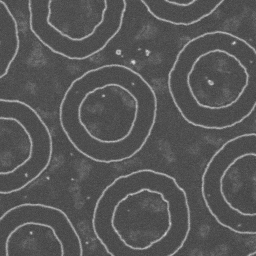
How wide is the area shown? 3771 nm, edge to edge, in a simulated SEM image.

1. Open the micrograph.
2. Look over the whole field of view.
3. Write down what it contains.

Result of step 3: ring-shaped raised bodies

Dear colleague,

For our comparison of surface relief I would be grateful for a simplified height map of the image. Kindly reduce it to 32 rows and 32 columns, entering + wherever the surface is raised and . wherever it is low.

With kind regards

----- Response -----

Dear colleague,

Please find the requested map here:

+...++.......+++..++++.++++.....
+...++.......++....+++++++......
++..++.......++.....+++++.......
++..+++.....+++.................
++...+++...+++...........++++...
++....+++++++..........++++++++.
++.....+++++...........+++..++++
++....................+++.....++
+...........++++......++......++
..........++++++++...+++.......+
.........+++++++++...+++.......+
........+++.....+++..+++......++
........+++......++...+++....+++
++++....++.......++...++++++++++
+++++...++.......++....++++++++.
..++++..++.......++.....+++++...
...+++..+++.....+++.............
....++...++++..+++...........+++
....++....++++++++..........++++
....++.....+++++...........++++.
...+++....................+++...
.++++............++.......++....
++++..........++++++++...+++....
+++..........++++++++++..+++....
.............+++....+++..+++....
............+++......++...+++...
.+++++++....++.......+++..++++..
+++++++++...++.......+++...+++++
++....+++...++.......+++.....+++
+......+++..+++.....+++.........
+.......++...+++...++++.........
+.......++....++++++++..........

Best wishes